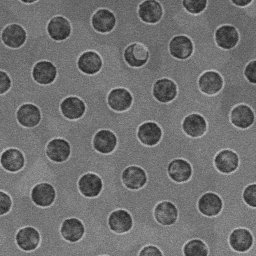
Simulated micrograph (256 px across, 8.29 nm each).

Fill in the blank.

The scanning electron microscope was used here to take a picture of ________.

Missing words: a regular array of holes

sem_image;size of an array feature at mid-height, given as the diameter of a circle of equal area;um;0.204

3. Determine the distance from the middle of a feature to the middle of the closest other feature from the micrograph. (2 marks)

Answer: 374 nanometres